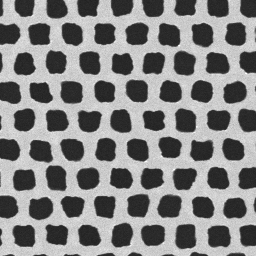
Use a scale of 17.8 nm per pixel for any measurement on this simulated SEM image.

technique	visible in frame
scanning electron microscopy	a regular array of holes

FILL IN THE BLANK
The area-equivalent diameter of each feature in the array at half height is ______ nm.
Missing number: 406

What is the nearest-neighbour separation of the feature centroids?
562 nanometers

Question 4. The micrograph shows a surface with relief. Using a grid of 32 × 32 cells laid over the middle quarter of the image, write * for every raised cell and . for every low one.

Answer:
****.....***.....***.....**.....
****.....***.....***.....***....
*******..*****..****.********...
********************************
...*****...*****....*****...****
.....***.....***.....***.....***
.....**......***.....***.....***
.....***.....***.....***.....***
.....***.....***.....***.....***
....*****...******..*****...****
********************************
*************...*************..*
****.....***....****.....***....
.***.....***....****.....***....
.***.....***.....***.....***....
.***.....***.....***.....***....
****....*****....*****..*****...
********************************
**********.**************..*****
....****.....***.....***.....***
.....***.....***.....***.....***
.....***.....***.....***.....***
.....***.....***.....***.....***
....****.....****....******.****
***********.********************
********************************
****....****....****.....***....
***......***.....***.....**.....
.**......**......**......**.....
.**......**......**......**.....
.***....****.....***....****....
*****.***********************..*